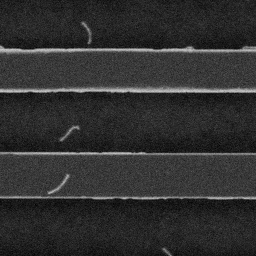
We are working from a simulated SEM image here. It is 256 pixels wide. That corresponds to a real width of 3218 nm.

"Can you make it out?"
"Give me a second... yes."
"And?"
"lines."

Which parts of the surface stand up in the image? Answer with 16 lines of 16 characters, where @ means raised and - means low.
----------------
----------------
----------------
@@@@@@@@@@@@@@@@
@@@@@@@@@@@@@@@@
@@@@@@@@@@@@@@@@
----------------
----------------
----------------
----------------
@@@@@@@@@@@@@@@@
@@@@@@@@@@@@@@@@
----------------
----------------
----------------
----------------